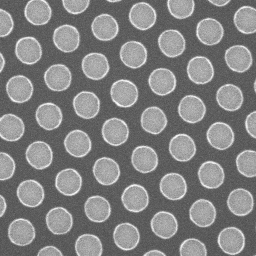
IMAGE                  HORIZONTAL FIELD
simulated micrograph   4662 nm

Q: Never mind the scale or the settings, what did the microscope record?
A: a regular array of holes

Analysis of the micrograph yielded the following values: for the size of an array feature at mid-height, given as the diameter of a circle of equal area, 454 nanometers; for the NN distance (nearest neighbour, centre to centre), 715 nm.